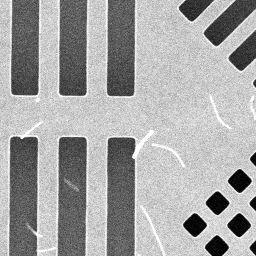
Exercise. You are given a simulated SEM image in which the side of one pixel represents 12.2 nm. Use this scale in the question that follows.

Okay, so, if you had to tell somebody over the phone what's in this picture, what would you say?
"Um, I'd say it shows groups of lines, slits or small figures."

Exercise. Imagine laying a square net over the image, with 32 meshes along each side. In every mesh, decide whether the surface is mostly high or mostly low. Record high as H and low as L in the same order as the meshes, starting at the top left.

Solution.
HLLLLHHLLLLHHLLLLHHHHHHLLLHHHLLL
HLLLLHHLLLLHHLLLLHHHHHHLLHHHLLLL
HLLLLHHLLLLHHLLLLHHHHHHHHHHLLLLH
HLLLLHHLLLLHHLLLLHHHHHHHHHLLLLHH
HLLLLHHLLLLHHLLLLHHHHHHHHHLLLHHL
HLLLLHHLLLLHHLLLLHHHHHHHHHHLHHLL
HLLLLHHLLLLHHLLLLHHHHHHHHHHHHLLL
HLLLLHHLLLLHHLLLLHHHHHHHHHHHHLLL
HLLLLHHLLLLHHLLLLHHHHHHHHHHHHLLH
HLLLLHHLLLLHHLLLLHHHHHHHHHHHHHHH
HLLLLHHLLLLHHLLLLHHHHHHHHHHHHHHH
HLLLLHHLLLLHHLLLLHHHHHHHHHHHHHHH
HHHHHHHHHHHHHHHHHHHHHHHHHHHHHHHH
HHHHHHHHHHHHHHHHHHHHHHHHHHHHHHHH
HHHHHHHHHHHHHHHHHHHHHHHHHHHHHHHH
HHHHHHHHHHHHHHHHHHHHHHHHHHHHHHHH
HHHHHHHHHHHHHHHHHHHHHHHHHHHHHHHH
HLLLLHHLLLLHHHLLLHHHHHHHHHHHHHHH
HLLLLHHLLLLHHLLLLHHHHHHHHHHHHHHH
HLLLLHHLLLLHHLLLLHHHHHHHHHHHHHHH
HLLLLHHLLLLHHLLLLHHHHHHHHHHHHHHH
HLLLLHHLLLLHHLLLLHHHHHHHHHHHHLLH
HLLLLHHLLLLHHLLLLHHHHHHHHHHHHLLH
HLLLLHHLLLLHHLLLLHHHHHHHHHHHHLLH
HLLLLHHLLLLHHLLLLHHHHHHHHHLLHHHH
HLLLLHHLLLLHHLLLLHHHHHHHHHLLLHHL
HLLLLHHLLLLHHLLLLHHHHHHHHHHLHHHH
HLLLLHHLLLLHHLLLLHHHHHHLLHHHHLLH
HLLLLHHLLLLHHLLLLHHHHHHLLLHHHLLH
HLLLLHHLLLLHHLLLLHHHHHHHHHHHHHHH
HLLLLHHLLLLHHLLLLHHHHHHHHHLLHHHL
HLLLLHHLLLLHHLLLLHHHHHHHHHLLHHHH